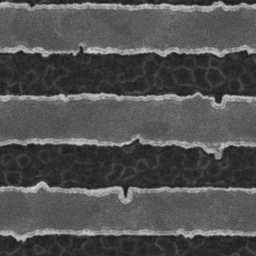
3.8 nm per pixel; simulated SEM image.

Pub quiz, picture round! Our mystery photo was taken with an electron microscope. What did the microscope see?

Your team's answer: one or a few lines or trenches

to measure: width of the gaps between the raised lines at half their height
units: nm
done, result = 166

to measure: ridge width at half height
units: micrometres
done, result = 0.181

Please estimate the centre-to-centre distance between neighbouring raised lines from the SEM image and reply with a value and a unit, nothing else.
347 nm